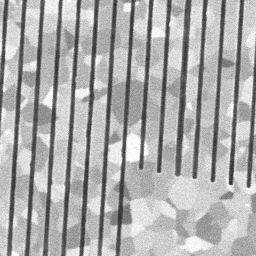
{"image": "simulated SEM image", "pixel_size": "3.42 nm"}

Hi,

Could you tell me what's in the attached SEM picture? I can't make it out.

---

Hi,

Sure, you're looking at parallel lines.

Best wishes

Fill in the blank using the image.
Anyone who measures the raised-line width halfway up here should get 45.7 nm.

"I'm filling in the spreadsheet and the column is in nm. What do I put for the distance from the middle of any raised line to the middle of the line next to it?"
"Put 61.9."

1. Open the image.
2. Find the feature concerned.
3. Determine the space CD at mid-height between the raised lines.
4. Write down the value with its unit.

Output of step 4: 4.5 px